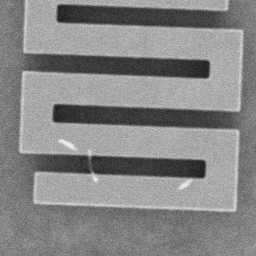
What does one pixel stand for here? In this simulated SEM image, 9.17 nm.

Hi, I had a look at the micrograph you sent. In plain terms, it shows groups of lines, slits or small figures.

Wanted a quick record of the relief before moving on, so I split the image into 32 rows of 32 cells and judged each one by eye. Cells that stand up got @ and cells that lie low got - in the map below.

---@@@@@@@@@@@@@@@@@@@@@@@@@----
---@@@@-------------------------
---@@@@-------------------------
---@@@@@@@@@@@@@@@@@@@@---------
---@@@@@@@@@@@@@@@@@@@@@@@@@@@--
---@@@@@@@@@@@@@@@@@@@@@@@@@@@--
---@@@@@@@@@@@@@@@@@@@@@@@@@@@--
--------------------------@@@@--
--------------------------@@@@--
---@@@@@@@@@@@@@@---------@@@@--
---@@@@@@@@@@@@@@@@@@@@@@@@@@@--
---@@@@@@@@@@@@@@@@@@@@@@@@@@@--
---@@@@@@@@@@@@@@@@@@@@@@@@@@@--
---@@@@---------------@@@@@@@@--
---@@@@-------------------------
---@@@@@@@----------------------
---@@@@@@@@@@@@@@@@@@@@@@@@@@@--
---@@@@@@@@@@@@@@@@@@@@@@@@@@@--
---@@@@@@@@@@@@@@@@@@@@@@@@@@@--
---------------@@@@@@@@@@@@@@@--
--------------------------@@@@--
--------------------------@@@@--
----@@@@@@@@@@@@@@@@@@@@@@@@@---
----@@@@@@@@@@@@@@@@@@@@@@@@@---
----@@@@@@@@@@@@@@@@@@@@@@@@@---
---------@@@@@@@@@@@@@@@@@@@@---
--------------------------------
--------------------------------
--------------------------------
--------------------------------
--------------------------------
--------------------------------